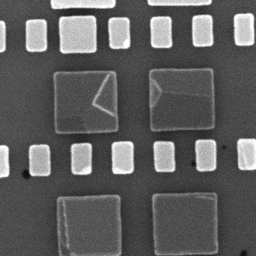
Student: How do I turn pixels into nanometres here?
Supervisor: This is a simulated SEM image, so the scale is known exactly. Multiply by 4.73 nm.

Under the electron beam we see wiring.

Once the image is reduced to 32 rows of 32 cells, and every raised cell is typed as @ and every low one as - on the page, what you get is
------@@@@@@@@-----@@@@@@@------
--------------------------------
--------@@@@--@@---@@---@@---@@@
@--@@@-@@@@@--@@---@@---@@---@@@
@--@@@--@@@@--@@---@@---@@---@@@
@--@@@--@@@@--@@---@@---@@----@-
--------@@@@--------------------
--------------------------------
--------------------------------
-------@@@@@@@-----@@@@@@@@-----
-------@@@@@@@-----@@@@@@@@-----
-------@@@@@@@@----@@@@@@@@-----
-------@@@@@@@@----@@@@@@@@-----
-------@@@@@@@@----@@@@@@@@-----
-------@@@@@@@@----@@@@@@@@-----
-------@@@@@@@@----@@@@@@@@-----
-------@@@@@@-------------------
--------------------------------
@---@@---@@---@@@--@@@---@@---@@
@---@@---@@---@@@--@@@---@@---@@
@---@@---@@---@@@--@@@---@@---@@
@---@@---@@---@@----------------
--------------------------------
--------------------------------
-------------------@@@@@@@@-----
-------@@@@@@@@----@@@@@@@@-----
-------@@@@@@@@----@@@@@@@@-----
-------@@@@@@@@----@@@@@@@@-----
-------@@@@@@@@----@@@@@@@@-----
-------@@@@@@@@----@@@@@@@@-----
-------@@@@@@@@----@@@@@@@@-----
-------@@@@@@@@----@@@@@@@@-----